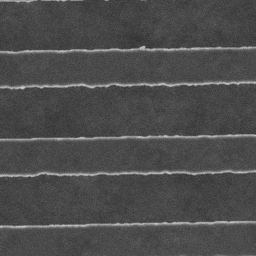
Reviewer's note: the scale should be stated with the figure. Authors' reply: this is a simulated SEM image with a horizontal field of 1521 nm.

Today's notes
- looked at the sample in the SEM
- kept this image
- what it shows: lines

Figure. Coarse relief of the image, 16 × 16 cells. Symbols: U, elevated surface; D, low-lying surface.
DDDDDDDDDDDDDDDD
DDDDDDDDDDDDDDDD
DDDDDDDDDDDDDDDD
UUUUUUUUUUUUUUUU
UUUUUUUUUUUUUUUU
UDDDDDDDDDDDDDDD
DDDDDDDDDDDDDDDD
DDDDDDDDDDDDDDDD
DDDDDDDDDDUUUUUU
UUUUUUUUUUUUUUUU
UUUUUUUUUUUUUUUU
DDDDDDDDDDDDDDDD
DDDDDDDDDDDDDDDD
DDDDDDDDDDDDDDDD
UUUUUUUUUUUUUUUU
UUUUUUUUUUUUUUUU